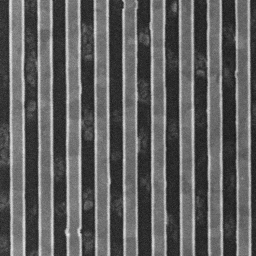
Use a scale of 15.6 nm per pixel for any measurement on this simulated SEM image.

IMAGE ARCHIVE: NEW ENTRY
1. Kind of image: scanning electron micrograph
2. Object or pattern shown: parallel lines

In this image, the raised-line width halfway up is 200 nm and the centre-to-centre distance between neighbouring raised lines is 0.44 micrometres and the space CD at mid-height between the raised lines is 243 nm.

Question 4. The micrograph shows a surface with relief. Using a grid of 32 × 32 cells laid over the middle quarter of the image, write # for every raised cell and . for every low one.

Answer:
.###....###....###....###....###
.###....###....###....###....###
.###....###....###....###....###
.###....###....###....###....###
.###....###....###....###....###
.###....###....###....###....###
.###....###....###....###....###
.###....###....###....###....###
.###....###....###....###....###
.###....###....###....###....###
.###....###....###....###....###
.###....###....###....###....###
.###....###....###....###....###
.###....###....###....###....###
.###....###....###....###....###
.###....###....###....###....###
.###....###....###....###....###
.###....###....###....###....###
.###....###....###....###....###
.###....###....###....###....###
.###....###....###....###....###
.###....###....###....###....###
.###....###....###....###....###
.###....###....###....###....###
.###....###....###....###....###
.###....###....###....###....###
.###....###....###....###....###
.###....###....###....###....###
.###....###....###....###....###
.###....###....###....###....###
.###....###....###....###....###
.###....###....###....###....###